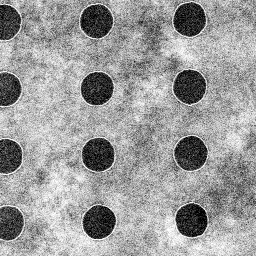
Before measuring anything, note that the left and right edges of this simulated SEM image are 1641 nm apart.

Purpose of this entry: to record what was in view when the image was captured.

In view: a regular array of raised bodies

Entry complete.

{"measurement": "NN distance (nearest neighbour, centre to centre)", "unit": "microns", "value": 0.429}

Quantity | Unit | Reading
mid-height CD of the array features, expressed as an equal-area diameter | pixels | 35.2